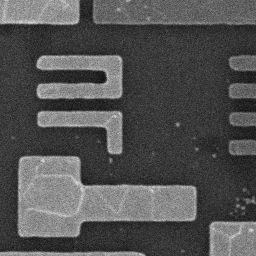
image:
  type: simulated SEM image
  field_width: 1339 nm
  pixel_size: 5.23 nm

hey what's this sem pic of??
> wiring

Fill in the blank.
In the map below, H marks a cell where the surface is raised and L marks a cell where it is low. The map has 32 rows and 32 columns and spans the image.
HHHHHHHHHHLLHHHHHHHHHHHHHHHHHHHH
HHHHHHHHHHLLHHHHHHHHHHHHHHHHHHHH
HHHHHHHHHHLLHHHHHHHHHHHHHHHHHHHH
LLLLLLLLLLLLLLLLLLLLLLLLLLLLLLLL
LLLLLLLLLLLLLLLLLLLLLLLLLLLLLLLL
LLLLLLLLLLLLLLLLLLLLLLLLLLLLLLLL
LLLLLLLLLLLLLLLLLLLLLLLLLLLLLLLL
LLLLLHHHHHHHHHHLLLLLLLLLLLLLLHHH
LLLLLHHHHHHHHHHLLLLLLLLLLLLLLHHH
LLLLLLLLLLLLLHHLLLLLLLLLLLLLLLLL
LLLLLLHHLHHHHHHLLLLLLLLLLLLLLHHL
LLLLLHHHHHHHHHHLLLLLLLLLLLLLLHHH
LLLLLLLLLLLLLLLLLLLLLLLLLLLLLLLL
LLLLLLLLLLLLLLLLLLLLLLLLLLLLLLLL
LLLLLHHHHHHHHHHLLLLLLLLLLLLLLHHH
LLLLLHHHHHHHHHHLLLLLLLLLLLLLLHHH
LLLLLLLLLLLLLHHLLLLLLLLLLLLLLLLL
LLLLLLLLLLLLLHHLLLLLLLLLLLLLLLLL
LLLLLLLLLLLLLHHLLLLLLLLLLLLLLHHH
LLLLLLLLLLLLLLLLLLLLLLLLLLLLLLLL
LLHHHHHHHHLLLLLLLLLLLLLLLLLLLLLL
LLHHHHHHHHLLLLLLLLLLLLLLLLLLLLLL
LLHHHHHHHHLLLLLLLLLLLLLLLLLLLLLL
LLHHHHHHHHHHHHHHHHHHHHHHLLLLLLLL
LLHHHHHHHHHHHHHHHHHHHHHHLLLLLLLL
LLHHHHHHHHHHHHHHHHHHHHHHLLLLLLLL
LLHHHHHHHHHHHHHHHHHHHHHHLLLLLLLL
LLHHHHHHHHHHHHHHHHHHHHHHLLLLLLLL
LLHHHHHHHHLLLLLLLLLLLLLLLLHHHHHH
LLLHHHHHHLLLLLLLLLLLLLLLLLHHHHHH
LLLLLLLLLLLLLLLLLLLLLLLLLLHHHHHH
LLLLLLLLLLLLLLLLLLLLLLLLLLHHHHHH